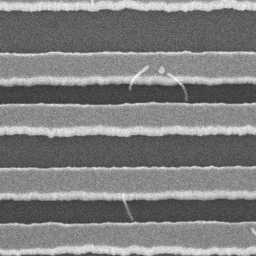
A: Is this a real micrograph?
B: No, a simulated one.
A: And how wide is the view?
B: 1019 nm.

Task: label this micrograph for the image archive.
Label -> lines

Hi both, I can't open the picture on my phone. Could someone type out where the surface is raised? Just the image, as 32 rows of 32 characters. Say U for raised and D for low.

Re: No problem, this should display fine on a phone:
UUUUUUUUUUUUUUUUUUUUUUUUUUUUUUUU
DDDDDDDDDDDDDDDDDDDDDDDDDDDDDDDD
DDDDDDDDDDDDDDDDDDDDDDDDDDDDDDDD
DDDDDDDDDDDDDDDDDDDDDDDDDDDDDDDD
DDDDDDDDDDDDDDDDDDDDDDDDDDDDDDDD
DDDDDDDDDDDDDDDDDDDDDDDDDDDDDDDD
DDDDDDDDDDDDDDDDDDDDDDDUDDDDDDDD
UUUUUUUUUUUUUUUUUUUUUUUUUUUUUUUU
UUUUUUUUUUUUUUUUUUUUUUUUUUUUUUUU
UUUUUUUUUUUUUUUUUUUUUUUUUUUUUUUU
UUUUDDDUDUUDDDDDDDDDUUDDDDUDDDDD
DDDDDDDDDDDDDDDDDDDDDDDDDDDDDDDD
DDDDDDDDDDDDDDDDDDDDDDDDDDDDDDDD
UUUUUUUUUUUUUUUUUUUUUUUUUUUUUUUU
UUUUUUUUUUUUUUUUUUUUUUUUUUUUUUUU
UUUUUUUUUUUUUUUUUUUUUUUUUUUUUUUU
UUUUUUUUUUUUUUUUUUUUUUUUUUUUUUUU
DDDDDDDDDDDDDDDDDDDDDDDDDDDDDDDD
DDDDDDDDDDDDDDDDDDDDDDDDDDDDDDDD
DDDDDDDDDDDDDDDDDDDDDDDDDDDDDDDD
DDDDDDDDDDDDDDDDDDDDDDDDDDDDDDDD
UUUUUUUUUUUUUUUUUUUUUUUUUUUUUUUU
UUUUUUUUUUUUUUUUUUUUUUUUUUUUUUUU
UUUUUUUUUUUUUUUUUUUUUUUUUUUUUUUU
UUUUUUUUUUUUUUUUUUUUUUUUUUUUUUUU
DDDDDDDDDDDDDDDDDDDDDDDDDDDDDDDD
DDDDDDDDDDDDDDDDDDDDDDDDDDDDDDDD
DDDDDDDDDDDDDDDDDDDDDDDDDDDDDDDD
UUUUUUUUUUUUUUUUUUUUUUUUUUUUUUUU
UUUUUUUUUUUUUUUUUUUUUUUUUUUUUUUU
UUUUUUUUUUUUUUUUUUUUUUUUUUUUUUUU
UUUUUUUUUUUDUUUUUUUUUUUUUUUUUUUU